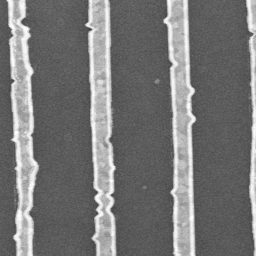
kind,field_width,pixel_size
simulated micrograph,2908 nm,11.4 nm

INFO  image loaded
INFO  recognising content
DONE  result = one or a few lines or trenches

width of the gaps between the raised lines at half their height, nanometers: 728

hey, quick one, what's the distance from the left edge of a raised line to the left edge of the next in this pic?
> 904 nm